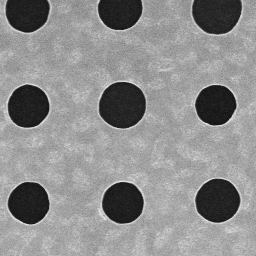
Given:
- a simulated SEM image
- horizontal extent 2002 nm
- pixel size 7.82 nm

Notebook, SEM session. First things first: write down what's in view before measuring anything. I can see holes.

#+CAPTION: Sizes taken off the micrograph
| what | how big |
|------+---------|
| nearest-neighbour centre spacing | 733 nanometres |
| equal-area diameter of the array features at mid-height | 330 nanometers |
